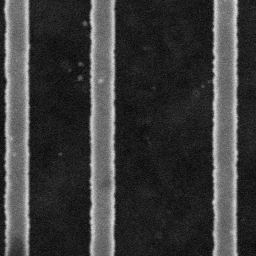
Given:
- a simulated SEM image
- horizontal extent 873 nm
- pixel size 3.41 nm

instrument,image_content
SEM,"lines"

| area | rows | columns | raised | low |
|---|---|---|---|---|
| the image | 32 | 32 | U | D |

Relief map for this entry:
DUUUDDDDDDDUUUDDDDDDDDDDDDDUUUDD
DUUUDDDDDDDUUUDDDDDDDDDDDDDUUUDD
DUUUDDDDDDDUUUDDDDDDDDDDDDDUUUDD
DUUUDDDDDDDUUUDDDDDDDDDDDDDUUUDD
DUUUDDDDDDDUUUDDDDDDDDDDDDDUUUDD
DUUUDDDDDDDUUUDDDDDDDDDDDDDUUUDD
DUUUDDDDDDDUUUDDDDDDDDDDDDDUUUDD
DUUUDDDDDDDUUUDDDDDDDDDDDDDUUUDD
DUUUDDDDDDDUUUDDDDDDDDDDDDDUUUDD
DUUUDDDDDDDUUUDDDDDDDDDDDDDUUUDD
DUUUDDDDDDDUUUDDDDDDDDDDDDDUUUDD
DUUUDDDDDDDUUUDDDDDDDDDDDDDUUUDD
DUUUDDDDDDDUUUDDDDDDDDDDDDDUUUDD
DUUUDDDDDDDUUUDDDDDDDDDDDDDUUUDD
DUUUDDDDDDDUUUDDDDDDDDDDDDDUUUDD
DUUUDDDDDDDUUUDDDDDDDDDDDDDUUUDD
DUUUDDDDDDDUUUDDDDDDDDDDDDDUUUDD
DUUUDDDDDDDUUUDDDDDDDDDDDDDUUUDD
DUUUDDDDDDDUUUDDDDDDDDDDDDDUUUDD
DUUUDDDDDDDUUUDDDDDDDDDDDDDUUUDD
DUUUDDDDDDDUUUDDDDDDDDDDDDDUUUDD
DUUUDDDDDDDUUUDDDDDDDDDDDDDUUUDD
DUUUDDDDDDDUUUDDDDDDDDDDDDDUUUDD
DUUUDDDDDDDUUUDDDDDDDDDDDDDUUUDD
DUUUDDDDDDDUUUDDDDDDDDDDDDDUUUDD
DUUUDDDDDDDUUUDDDDDDDDDDDDDUUUDD
DUUUDDDDDDDUUUDDDDDDDDDDDDDUUUDD
DUUUDDDDDDDUUUDDDDDDDDDDDDDUUUDD
DUUUDDDDDDDUUUDDDDDDDDDDDDDUUUDD
DUUUDDDDDDDUUUDDDDDDDDDDDDDUUUDD
DUUUDDDDDDDUUUDDDDDDDDDDDDDUUUDD
DUUUDDDDDDDUUUDDDDDDDDDDDDDUUUDD